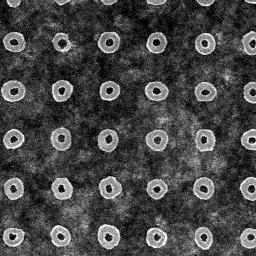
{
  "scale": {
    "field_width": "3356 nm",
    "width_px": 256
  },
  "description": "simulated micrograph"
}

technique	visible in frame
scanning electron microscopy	a regular array of ring-shaped raised bodies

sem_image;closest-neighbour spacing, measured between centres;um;0.622